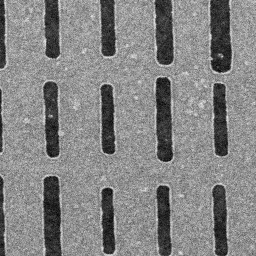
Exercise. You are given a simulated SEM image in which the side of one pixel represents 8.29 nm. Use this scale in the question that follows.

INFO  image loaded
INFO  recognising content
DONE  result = holes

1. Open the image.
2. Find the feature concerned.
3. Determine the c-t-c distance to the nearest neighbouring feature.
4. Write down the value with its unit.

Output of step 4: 55.9 pixels